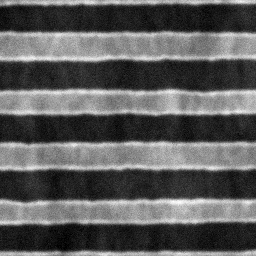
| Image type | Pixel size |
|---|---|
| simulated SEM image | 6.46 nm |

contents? lines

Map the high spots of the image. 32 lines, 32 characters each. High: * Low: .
**...*..........................
................................
................................
................................
********************************
********************************
********************************
................................
................................
................................
................................
....**..*****.......***.........
********************************
********************************
................................
................................
................................
................................
********************************
********************************
********************************
................................
................................
................................
................................
***.****************************
********************************
********************************
................................
................................
................................
................................